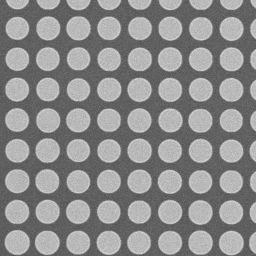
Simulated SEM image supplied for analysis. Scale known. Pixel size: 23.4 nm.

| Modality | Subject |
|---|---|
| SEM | an array of small figures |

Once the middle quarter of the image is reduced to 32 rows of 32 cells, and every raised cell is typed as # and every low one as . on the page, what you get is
.#####...#####...####...#####...
..........##......##.....###....
................................
................................
..####...#####...####...#####...
.#####...#####..######..#####...
.#####..######..######..#####..#
.#####...#####..######..#####...
..###....####....####....####...
................................
................................
..###.....##......##.....###....
.#####...#####...####...#####...
.#####..######..######..#####..#
.#####..######..######..#####..#
.#####...#####..#####...#####...
..###.....###....####....###....
................................
................................
..###.....###....####....###....
.#####...#####..######..#####...
.#####...#####..######..#####..#
.#####...#####..######..#####..#
.#####...####....####...#####...
..........................#.....
................................
................................
..####...####....####...#####...
.#####...#####..######..#####...
.#####..######..######..#####..#
.#####...#####..######..#####...
..###....####....####...#####...